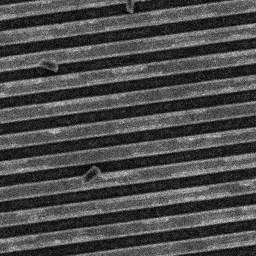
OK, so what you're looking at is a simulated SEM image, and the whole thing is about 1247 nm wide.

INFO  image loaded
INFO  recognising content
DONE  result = parallel lines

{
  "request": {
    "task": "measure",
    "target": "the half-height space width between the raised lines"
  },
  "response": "62.1 nanometres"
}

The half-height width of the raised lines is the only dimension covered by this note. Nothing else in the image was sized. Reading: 0.0621 um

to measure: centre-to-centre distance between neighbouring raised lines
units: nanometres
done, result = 125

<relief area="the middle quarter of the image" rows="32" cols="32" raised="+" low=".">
..................++++++++++++++
...........+++++++++++++++++++++
....++++++++++++++++++++++......
+++++++++++++++++++.............
+++++++++++.....................
++++.........................+++
......................++++++++++
..............++++++++++++++++++
.......++++++++++++++++++++++...
++++++++++++++++++++++..........
+++++++++++++++.................
+++++++.........................
...........................+++++
...................+++++++++++++
............++++++++++++++++++++
....+++++++++++++++++++++.......
++++++++++++++++++..............
++++++++++......................
+++...........................++
......................++++++++++
...............+++++++++++++++++
........+++++++++++++++++++++...
+++++++++++++++++++++...........
++++++++++++++..................
++++++..........................
..........................++++++
......+++.........++++++++++++++
.....+++++.+++++++++++++++++++++
...+++++++++++++++++++++++......
+++++++++++++++++...............
+++++++++.......................
++...........................+++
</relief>